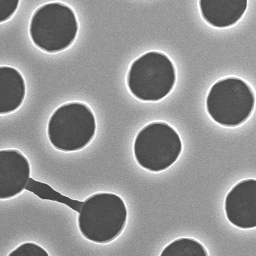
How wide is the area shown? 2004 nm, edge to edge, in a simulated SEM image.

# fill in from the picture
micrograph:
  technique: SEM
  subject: holes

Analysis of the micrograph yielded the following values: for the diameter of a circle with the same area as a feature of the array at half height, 377 nm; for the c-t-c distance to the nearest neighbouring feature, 0.648 um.